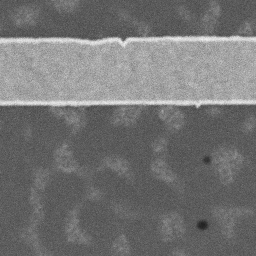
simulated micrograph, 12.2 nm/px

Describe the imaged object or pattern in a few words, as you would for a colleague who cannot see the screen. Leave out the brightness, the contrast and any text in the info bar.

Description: one or a few lines or trenches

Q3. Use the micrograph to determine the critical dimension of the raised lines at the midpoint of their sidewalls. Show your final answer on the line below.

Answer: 63.5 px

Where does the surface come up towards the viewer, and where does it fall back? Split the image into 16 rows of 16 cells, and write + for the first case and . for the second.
................
................
........++++++++
++++++++++++++++
++++++++++++++++
++++++++++++++++
................
................
................
................
................
................
................
................
................
................